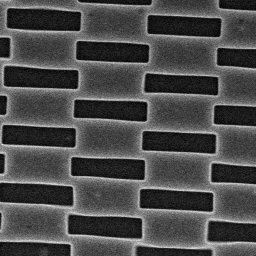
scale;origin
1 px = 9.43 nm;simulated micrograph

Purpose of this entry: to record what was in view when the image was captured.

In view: groups of lines, slits or small figures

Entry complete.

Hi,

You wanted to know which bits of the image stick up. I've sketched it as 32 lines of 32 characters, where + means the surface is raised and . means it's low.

+++++++++++++......++++++++.....
+.........++++++++++++++++++++++
+.........++++++++..........++++
+.........++++++++..........++++
+++++++++++++++++++++......+++++
.+++++++++........++++++++++++++
.++++++++..........++++++++.....
++++++++++.........++++++++.....
+....+++++++++++++++++++++++++..
..........++++++++.........+++++
+.........++++++++.........+++++
++++++++++++++++++.........+++++
.+++++++++......++++++++++++++++
.++++++++.........+++++++++.....
+++++++++.........+++++++++.....
+++++++++++++++++++++++++++.....
.........+++++++++.....+++++++++
..........++++++++.........+++++
++++++++++++++++++.........+++++
.+++++++++++++++++++++++++++++++
.++++++++.........+++++++++..+++
.++++++++.........++++++++......
++++++++++++++++..++++++++......
.........+++++++++++++++++++++++
.........++++++++..........+++++
++++.....++++++++..........+++++
+++++++++++++++++++++++++.++++++
++++++++..........++++++++.+++++
++++++++..........++++++++......
+++++++++++.......++++++++......
........++++++++++++++++++++++++
.........++++++++..........+++++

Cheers